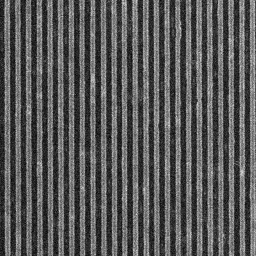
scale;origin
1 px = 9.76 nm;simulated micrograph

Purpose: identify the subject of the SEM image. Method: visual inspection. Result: parallel lines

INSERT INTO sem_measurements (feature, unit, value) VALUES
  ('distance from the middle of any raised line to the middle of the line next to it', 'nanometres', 104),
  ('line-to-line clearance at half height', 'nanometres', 56.1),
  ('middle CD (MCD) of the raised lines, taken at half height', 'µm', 0.0464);